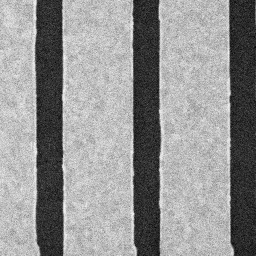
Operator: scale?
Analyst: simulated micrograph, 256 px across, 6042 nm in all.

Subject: wiring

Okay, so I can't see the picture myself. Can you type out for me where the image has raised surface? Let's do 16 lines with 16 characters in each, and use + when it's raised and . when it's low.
++..++++..++++..
++..++++..++++..
++..++++..++++..
++..++++..++++..
++..++++..++++..
++..++++..++++..
++..++++..++++..
++..++++..++++..
++..++++..++++..
++..++++..++++..
++..++++..++++..
++..++++..++++..
++..++++..++++..
++..++++..++++..
++..++++..++++..
++..++++..++++..